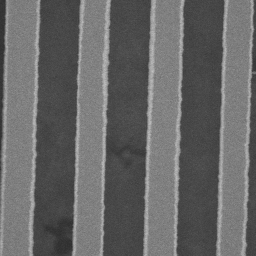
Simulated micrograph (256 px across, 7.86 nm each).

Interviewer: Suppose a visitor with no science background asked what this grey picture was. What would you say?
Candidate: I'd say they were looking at lines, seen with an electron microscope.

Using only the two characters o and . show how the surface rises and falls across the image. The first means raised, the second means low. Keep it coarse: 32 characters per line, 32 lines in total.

.oooo.....oooo.....oooo.....oooo
.oooo.....oooo.....oooo.....oooo
.oooo.....oooo.....oooo.....oooo
.oooo.....oooo.....oooo.....oooo
.oooo.....ooo......oooo.....oooo
.oooo.....ooo......oooo.....ooo.
.oooo.....ooo......oooo.....ooo.
.oooo.....ooo......oooo.....ooo.
.oooo.....ooo......oooo.....ooo.
.oooo.....ooo......oooo.....ooo.
.oooo.....ooo......oooo.....ooo.
.oooo.....ooo......oooo.....ooo.
ooooo.....ooo......oooo.....ooo.
ooooo.....ooo......oooo.....ooo.
ooooo.....ooo......oooo.....ooo.
oooo......ooo......ooo......ooo.
oooo......ooo......ooo......ooo.
oooo......ooo.....oooo......ooo.
oooo.....oooo.....oooo......ooo.
oooo.....oooo.....oooo......ooo.
oooo.....oooo.....oooo......ooo.
oooo.....oooo.....oooo.....oooo.
oooo.....oooo.....oooo.....oooo.
oooo.....oooo.....oooo.....oooo.
oooo.....oooo.....oooo.....oooo.
oooo.....oooo.....oooo.....oooo.
oooo.....oooo.....oooo.....oooo.
oooo.....oooo.....oooo.....oooo.
oooo.....oooo.....oooo.....oooo.
oooo.....oooo.....oooo.....oooo.
oooo.....oooo.....oooo.....oooo.
oooo.....oooo.....oooo.....oooo.